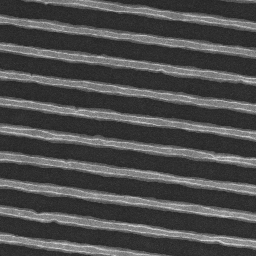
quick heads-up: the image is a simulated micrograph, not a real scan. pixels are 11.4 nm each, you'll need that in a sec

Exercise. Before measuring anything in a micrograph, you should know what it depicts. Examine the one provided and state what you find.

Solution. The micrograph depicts parallel lines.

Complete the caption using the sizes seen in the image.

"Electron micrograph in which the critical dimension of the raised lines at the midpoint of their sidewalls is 0.0877 micrometres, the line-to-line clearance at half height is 222 nanometres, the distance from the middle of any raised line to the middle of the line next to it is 309 nanometers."